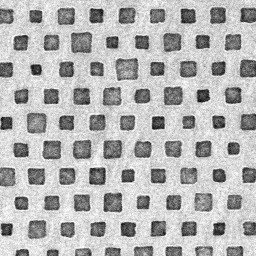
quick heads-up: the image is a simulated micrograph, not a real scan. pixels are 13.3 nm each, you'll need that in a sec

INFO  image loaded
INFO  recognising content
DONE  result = a regular array of holes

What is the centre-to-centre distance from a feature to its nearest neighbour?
0.397 µm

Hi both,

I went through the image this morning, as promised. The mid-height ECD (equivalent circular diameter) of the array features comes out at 223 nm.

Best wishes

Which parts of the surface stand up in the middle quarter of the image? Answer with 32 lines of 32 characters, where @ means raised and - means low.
--@@@@----@@@------@@----@@@@---
--@@@@----@@@------@@----@@@@---
--@@@@@---@@@------@@----@@@@---
@@@@@@@@@@@@@------@@@@@@@@@@@@@
@@@@@@@@@@@@@@@@@@@@@@@@@@@@@@@@
@@@@@@@@@@@@@@@@@@@@@@@@@@@--@@@
@@----@@@@----@@@@---@@@@-----@@
@@----@@@@----@@@@----@@@-----@@
@@-----@@@----@@@@----@@@-----@@
@@-----@@@-----@@@---@@@@-----@@
@@@@@@@@@@@-@-@@@@@@@@@@@@@@@@@@
@@@@@@@@@@@@@@@@@@@@@@@@@@@@@@@@
@@@@@@@---@@@@@@@@@@@@@@@@@@@@@@
---@@@-----@@@----@@@@---@@@@@--
--@@@@-----@@@----@@@@---@@@@---
---@@@-----@@@----@@@@---@@@@@--
--@@@@@---@@@@---@@@@@@@@@@@@@@@
@@@@@@@@@@@@@@@@@@@@@@@@@@@@@@@@
@@@@@@@@@@@@@@@@@@@@@@@@@@@@@@@@
@@-----@@@----@@@@----@@@----@@@
@@-----@@@-----@@-----@@@-----@@
@@-----@@@----@@@-----@@@-----@@
@@-----@@@----@@@-----@@@----@@@
@@@---@@@@----@@@@@--@@@@@@@-@@@
@@@@@@@@@@@@@@@@@@@@@@@@@@@@@@@@
@@@@@@@@@@@@@@@@@@@@@@@@@@@@@@@@
---@@@-----@@@@---@@@@---@@@@---
---@@@-----@@@----@@@@---@@@@---
---@@@-----@@@----@@@@----@@@---
---@@@----@@@@---@@@@@---@@@@---
@@@@@@@@@@@@@@@@@@@@@@@@@@@@@@@@
@@@@@@@@@@@@@@@@@@@@@@@@@@@@@@@@